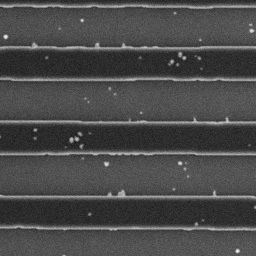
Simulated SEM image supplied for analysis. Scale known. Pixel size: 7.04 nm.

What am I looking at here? lines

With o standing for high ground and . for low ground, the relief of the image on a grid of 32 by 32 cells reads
oooooooooooooooooooooooooooooooo
................................
................................
................................
................................
................................
oooooooooooooooooooooooooooooooo
oooooooooooooooooooooooooooooooo
oooooooooooooooooooooooooooooooo
oooooooooooooooooooooooooooooooo
................................
................................
................................
................................
................................
oooooooooooooooooooooooooooooooo
oooooooooooooooooooooooooooooooo
oooooooooooooooooooooooooooooooo
oooooooooooooooooooooooooooooooo
................................
................................
................................
................................
................................
o...............................
oooooooooooooooooooooooooooooooo
oooooooooooooooooooooooooooooooo
oooooooooooooooooooooooooooooooo
....oooooooooooooooooooooooooooo
................................
................................
................................